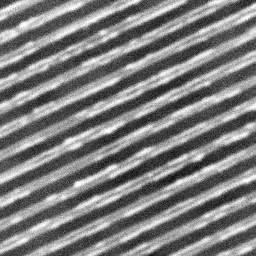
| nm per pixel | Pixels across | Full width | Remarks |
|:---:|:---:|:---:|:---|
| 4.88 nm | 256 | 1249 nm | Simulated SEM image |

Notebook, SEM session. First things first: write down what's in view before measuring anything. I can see parallel lines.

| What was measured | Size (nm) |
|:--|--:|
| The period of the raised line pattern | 102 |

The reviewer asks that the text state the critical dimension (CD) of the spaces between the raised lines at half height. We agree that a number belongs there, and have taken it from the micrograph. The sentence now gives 0.0633 µm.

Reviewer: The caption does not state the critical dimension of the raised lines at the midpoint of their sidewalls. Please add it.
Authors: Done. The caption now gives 36.3 nanometers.